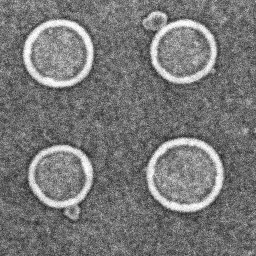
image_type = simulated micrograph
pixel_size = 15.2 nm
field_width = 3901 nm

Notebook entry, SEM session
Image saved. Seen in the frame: raised bodies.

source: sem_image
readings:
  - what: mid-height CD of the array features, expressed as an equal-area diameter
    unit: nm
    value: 943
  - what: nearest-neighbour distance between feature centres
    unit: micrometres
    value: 1.87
